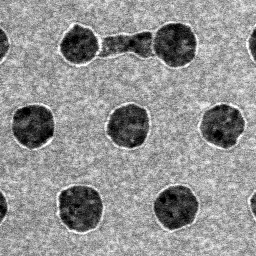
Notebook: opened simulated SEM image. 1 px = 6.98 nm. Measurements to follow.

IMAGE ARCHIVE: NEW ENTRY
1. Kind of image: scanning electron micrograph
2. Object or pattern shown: raised bodies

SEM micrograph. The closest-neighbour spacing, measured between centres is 654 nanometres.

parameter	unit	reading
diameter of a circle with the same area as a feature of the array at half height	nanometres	323